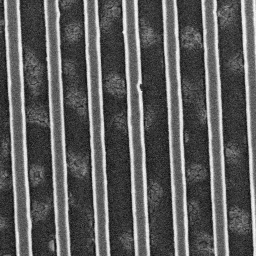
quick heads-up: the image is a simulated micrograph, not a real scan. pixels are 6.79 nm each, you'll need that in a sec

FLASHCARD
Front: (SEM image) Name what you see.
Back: parallel lines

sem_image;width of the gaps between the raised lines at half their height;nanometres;182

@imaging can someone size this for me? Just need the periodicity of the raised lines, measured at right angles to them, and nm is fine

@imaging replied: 268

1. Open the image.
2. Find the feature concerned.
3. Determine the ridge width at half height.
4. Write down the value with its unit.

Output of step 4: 13 pixels